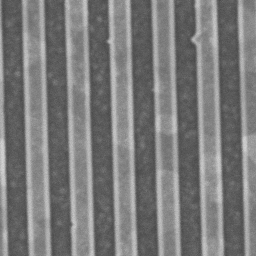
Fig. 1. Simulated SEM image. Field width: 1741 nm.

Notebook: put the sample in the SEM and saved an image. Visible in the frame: parallel lines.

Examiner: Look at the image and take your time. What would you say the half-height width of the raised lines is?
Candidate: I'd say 119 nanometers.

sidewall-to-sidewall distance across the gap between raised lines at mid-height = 173 nanometres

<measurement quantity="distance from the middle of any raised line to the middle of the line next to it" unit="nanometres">294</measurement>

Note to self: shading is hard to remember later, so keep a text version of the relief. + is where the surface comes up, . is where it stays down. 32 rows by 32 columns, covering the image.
...++...+++...++...++....++...++
...++...+++...++...++....++...++
...++...+++...++...++....++...++
...++....++...++...++....++...++
...++....++...++...++...+++...++
...++....++...++...+++...++...++
...++....++...++...+++...++...++
...++....++...++...+++...++...++
...++....++...++....++...++...++
...+++...++...++....++...++...++
...++....++...++....++...++...++
...+++...++...++....++...++...++
...+++...++...++....++...++...++
...+++...++...++....++...++...++
...+++...++...++....++...++...++
...+++...++...++....++...++...++
....++...++...++....++...++....+
....++...++...++....++...++....+
....++...++...+++...++...++....+
....++...++...+++...++...++....+
....++...++...++....++...++....+
....++...++....+....++...++....+
....++...++....++...++...++....+
....++...++....++...++...+++...+
....++...++....++...++...+++...+
....++...++....++...++...+++...+
+...++...++....++...++...+++...+
+...++...++....++...++...+++...+
+...++...++....++...++...+++...+
+...++...++....++...++...+++...+
+...++...++....++...++...+++...+
+...++...++....++...++....++...+